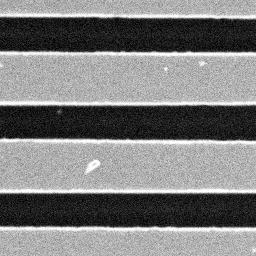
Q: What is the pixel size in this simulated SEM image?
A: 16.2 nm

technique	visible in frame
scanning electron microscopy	lines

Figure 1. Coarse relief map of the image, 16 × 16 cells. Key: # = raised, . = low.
################
................
................
################
################
################
################
................
................
################
################
################
................
................
################
################